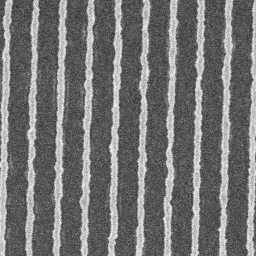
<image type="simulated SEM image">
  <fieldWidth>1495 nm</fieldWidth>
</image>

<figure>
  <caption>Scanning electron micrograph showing parallel lines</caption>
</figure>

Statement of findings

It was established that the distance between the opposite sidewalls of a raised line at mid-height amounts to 35.8 nm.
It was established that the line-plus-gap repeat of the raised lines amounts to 161 nanometres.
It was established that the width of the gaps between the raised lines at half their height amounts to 128 nm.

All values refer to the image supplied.